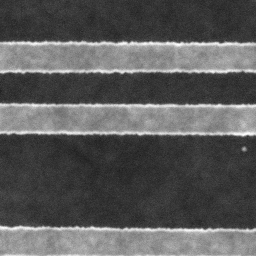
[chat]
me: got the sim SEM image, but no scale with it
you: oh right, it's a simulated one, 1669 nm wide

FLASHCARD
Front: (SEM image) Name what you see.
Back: lines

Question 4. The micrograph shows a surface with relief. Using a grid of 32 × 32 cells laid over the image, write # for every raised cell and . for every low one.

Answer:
................................
................................
................................
................................
................................
################################
################################
################################
################################
................................
................................
................................
................................
################################
################################
################################
################################
................................
................................
................................
................................
................................
................................
................................
................................
................................
................................
................................
##############..................
################################
################################
################################